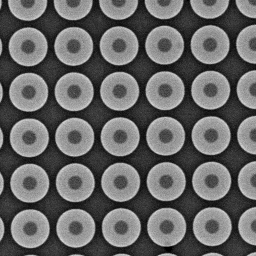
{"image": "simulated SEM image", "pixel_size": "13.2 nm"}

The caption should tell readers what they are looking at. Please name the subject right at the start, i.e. an array of small figures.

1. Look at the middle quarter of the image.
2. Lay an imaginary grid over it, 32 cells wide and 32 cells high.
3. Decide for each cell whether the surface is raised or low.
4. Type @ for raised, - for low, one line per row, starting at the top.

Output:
--------------------------------
--------------------------------
-@@@--------@@@@-------@@@@@----
@@@@@@----@@@@@@@-----@@@@@@@---
@@@@@@@---@@@@@@@@---@@@@@@@@@--
@@@@@@@--@@@@@@@@@---@@@@@@@@@--
@@@@@@@--@@@@@@@@@@--@@@@@@@@@--
@@@@@@@--@@@@@@@@@@--@@@@@@@@@--
@@@@@@@--@@@@@@@@@---@@@@@@@@@--
@@@@@@@---@@@@@@@@---@@@@@@@@---
@@@@@@-----@@@@@@-----@@@@@@----
-@@@----------------------------
--------------------------------
-------------@@---------@@@-----
@@@@@------@@@@@@-----@@@@@@@---
@@@@@@@---@@@@@@@@---@@@@@@@@---
@@@@@@@---@@@@@@@@---@@@@@@@@@--
@@@@@@@--@@@@@@@@@@--@@@@@@@@@--
@@@@@@@--@@@@@@@@@@--@@@@@@@@@--
@@@@@@@--@@@@@@@@@@--@@@@@@@@@--
@@@@@@@---@@@@@@@@---@@@@@@@@@--
@@@@@@-----@@@@@@@----@@@@@@@---
-@@@@-------@@@@--------@@@-----
--------------------------------
--------------------------------
-@@@@-------@@@@@------@@@@@----
@@@@@@-----@@@@@@@----@@@@@@@---
@@@@@@@---@@@@@@@@@--@@@@@@@@@--
@@@@@@@---@@@@@@@@@--@@@@@@@@@--
@@@@@@@@-@@@@@@@@@@--@@@@@@@@@--
@@@@@@@--@@@@@@@@@@--@@@@@@@@@--
@@@@@@@---@@@@@@@@---@@@@@@@@@--